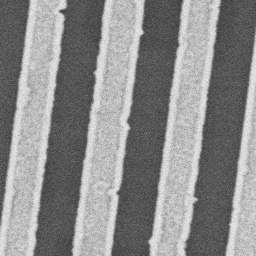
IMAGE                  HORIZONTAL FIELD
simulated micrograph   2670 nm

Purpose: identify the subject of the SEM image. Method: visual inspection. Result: one or a few lines or trenches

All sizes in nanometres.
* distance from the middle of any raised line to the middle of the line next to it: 793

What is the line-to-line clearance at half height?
481 nm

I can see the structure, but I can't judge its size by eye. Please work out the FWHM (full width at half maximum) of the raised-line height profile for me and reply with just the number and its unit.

303 nm